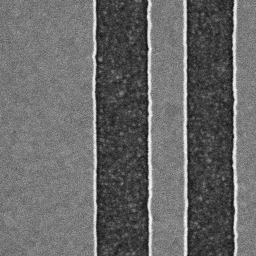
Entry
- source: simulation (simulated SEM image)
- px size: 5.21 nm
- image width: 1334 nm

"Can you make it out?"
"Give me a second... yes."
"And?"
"one or a few lines or trenches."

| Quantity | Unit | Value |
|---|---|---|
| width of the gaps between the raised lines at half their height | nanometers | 268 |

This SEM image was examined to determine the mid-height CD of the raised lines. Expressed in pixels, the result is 36.4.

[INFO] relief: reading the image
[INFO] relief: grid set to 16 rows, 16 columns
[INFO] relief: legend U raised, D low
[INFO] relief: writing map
UUUUUUDDDUUUDDDU
UUUUUUDDDUUUDDDU
UUUUUUDDDUUUDDDU
UUUUUUDDDUUUDDDU
UUUUUUDDDUUUDDDU
UUUUUUDDDUUUDDDU
UUUUUUDDDUUUDDDU
UUUUUUDDDUUUDDDU
UUUUUUDDDUUUDDDU
UUUUUUDDDUUUDDDU
UUUUUUDDDUUUDDDU
UUUUUUDDDUUUDDDU
UUUUUUDDDUUUDDDU
UUUUUUDDDUUUDDDU
UUUUUUDDDUUUDDDU
UUUUUUDDDUUUDDDU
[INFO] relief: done